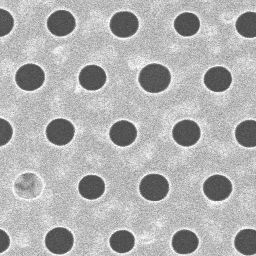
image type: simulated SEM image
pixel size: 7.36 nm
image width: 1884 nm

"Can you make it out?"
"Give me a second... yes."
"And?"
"a regular array of holes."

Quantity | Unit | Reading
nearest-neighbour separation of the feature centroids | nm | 460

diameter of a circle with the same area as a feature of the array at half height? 197 nanometres